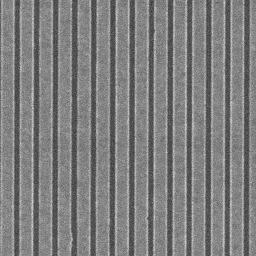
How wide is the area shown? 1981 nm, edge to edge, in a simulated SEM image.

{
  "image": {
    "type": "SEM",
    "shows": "parallel lines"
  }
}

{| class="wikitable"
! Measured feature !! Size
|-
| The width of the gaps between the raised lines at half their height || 52.3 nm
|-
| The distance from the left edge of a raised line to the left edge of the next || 148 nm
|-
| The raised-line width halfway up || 0.0987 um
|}